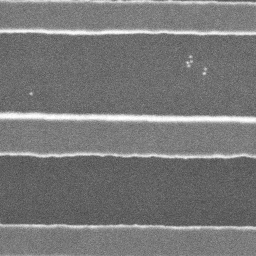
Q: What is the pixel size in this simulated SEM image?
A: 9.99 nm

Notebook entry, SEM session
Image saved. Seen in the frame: lines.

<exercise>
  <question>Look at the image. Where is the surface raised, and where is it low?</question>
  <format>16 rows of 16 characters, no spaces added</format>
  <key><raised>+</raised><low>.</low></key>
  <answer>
++++++++++++++++
++++++++++++++++
................
................
................
................
................
+++++++++++++++.
++++++++++++++++
++++++++++++++++
................
................
................
................
++++++++++++++++
++++++++++++++++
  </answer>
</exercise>